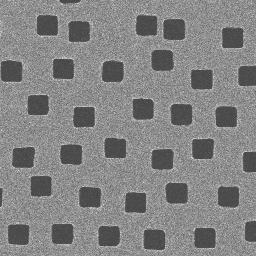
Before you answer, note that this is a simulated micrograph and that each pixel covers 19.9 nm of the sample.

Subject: a regular array of holes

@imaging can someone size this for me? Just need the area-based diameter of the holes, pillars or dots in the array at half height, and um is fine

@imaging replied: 0.463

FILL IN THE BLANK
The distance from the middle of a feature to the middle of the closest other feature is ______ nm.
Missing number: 797